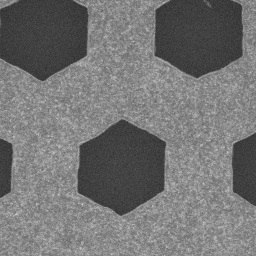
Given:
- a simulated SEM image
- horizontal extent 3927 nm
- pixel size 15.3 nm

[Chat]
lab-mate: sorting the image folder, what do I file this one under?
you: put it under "holes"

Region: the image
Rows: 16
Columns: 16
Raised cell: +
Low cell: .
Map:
.....+++++.....+
......++++.....+
.....+++++.....+
.....+++++.....+
++..+++++++..+++
++++++++++++++++
++++++++++++++++
++++++++++++++++
++++++....++++++
.++++.....+++++.
.++++.....+++++.
.++++.....+++++.
++++++...++++++.
++++++++++++++++
++++++++++++++++
++++++++++++++++